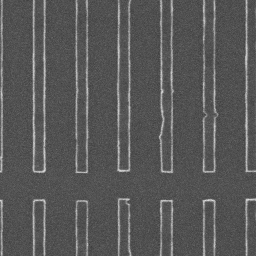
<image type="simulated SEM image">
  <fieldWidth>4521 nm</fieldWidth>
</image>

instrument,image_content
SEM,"parallel lines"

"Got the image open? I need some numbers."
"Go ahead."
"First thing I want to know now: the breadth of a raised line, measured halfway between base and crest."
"194 nanometres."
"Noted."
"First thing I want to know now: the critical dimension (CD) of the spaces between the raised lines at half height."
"565 nanometres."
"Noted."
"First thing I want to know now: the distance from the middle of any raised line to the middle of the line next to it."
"42.5 pixels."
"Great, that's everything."